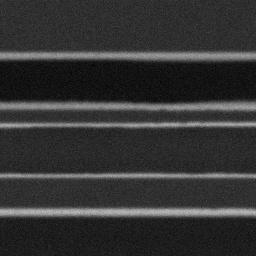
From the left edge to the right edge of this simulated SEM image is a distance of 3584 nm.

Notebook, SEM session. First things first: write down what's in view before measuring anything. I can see lines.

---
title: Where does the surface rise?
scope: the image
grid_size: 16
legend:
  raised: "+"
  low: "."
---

++++++++++++++++
++++++++++++++++
++++++++++++++++
................
................
................
................
++++++++++++++++
++++++++++++++++
++++++++++++++++
++++++++++++++++
++++++++++++++++
++++++++++++++++
................
................
................